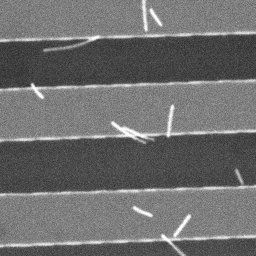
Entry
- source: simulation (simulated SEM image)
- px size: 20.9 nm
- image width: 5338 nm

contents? lines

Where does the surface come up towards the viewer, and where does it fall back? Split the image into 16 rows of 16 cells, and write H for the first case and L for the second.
HHHHHHHHHHHHHHHH
HHHHHHHHHHHHHHHH
HHHLLLLLLLLLLLLL
LLLLLLLLLLLLLLLL
LLLLLLLLLLLLLLLL
LHHHHHHHHHHHHHHH
HHHHHHHHHHHHHHHH
HHHHHHHHHHHHHHHH
HHHHHHHHHHLLLLLL
LLLLLLLLLLLLLLLL
LLLLLLLLLLLLLLLL
LLLLLLLLLLLLLLLL
HHHHHHHHHHHHHHHH
HHHHHHHHHHHHHHHH
HHHHHHHHHHHHHHHH
LLLLLLLLLLLLLLLL